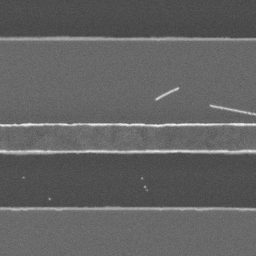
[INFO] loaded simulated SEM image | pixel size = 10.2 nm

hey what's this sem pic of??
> lines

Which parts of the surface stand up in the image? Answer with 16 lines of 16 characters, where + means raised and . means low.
................
................
++++++++++++++++
++++++++++++++++
++++++++++++++++
++++++++++++++++
++++++++++++++++
++++++++++++++++
++++++++++++++++
................
................
................
................
++++++++++++++++
++++++++++++++++
++++++++++++++++